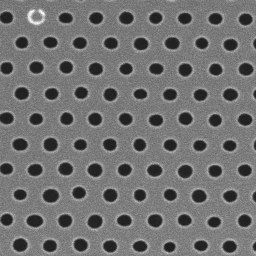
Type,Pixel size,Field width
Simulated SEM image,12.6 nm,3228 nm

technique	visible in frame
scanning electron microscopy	a regular array of holes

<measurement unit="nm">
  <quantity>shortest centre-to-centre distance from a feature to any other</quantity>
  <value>361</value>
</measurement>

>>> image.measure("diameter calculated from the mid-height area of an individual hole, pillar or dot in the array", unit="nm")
168